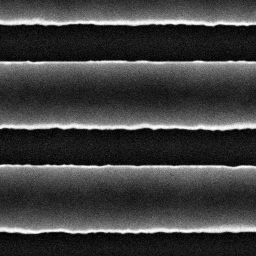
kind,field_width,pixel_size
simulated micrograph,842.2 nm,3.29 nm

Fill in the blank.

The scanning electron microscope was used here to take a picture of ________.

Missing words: lines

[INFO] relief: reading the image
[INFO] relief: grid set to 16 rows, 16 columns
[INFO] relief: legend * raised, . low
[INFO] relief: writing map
****************
*****.**********
................
................
****************
****************
****************
****************
................
................
****************
****************
****************
****************
.**.**********..
................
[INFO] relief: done